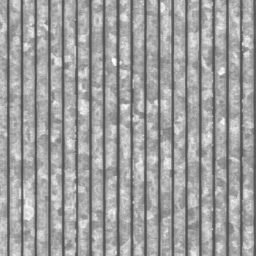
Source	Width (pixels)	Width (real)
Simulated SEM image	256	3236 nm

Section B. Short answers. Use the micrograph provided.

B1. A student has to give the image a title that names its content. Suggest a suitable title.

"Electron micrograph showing parallel lines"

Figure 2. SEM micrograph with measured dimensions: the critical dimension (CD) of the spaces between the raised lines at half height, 42.6 nanometers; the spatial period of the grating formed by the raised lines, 173 nm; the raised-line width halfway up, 131 nm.